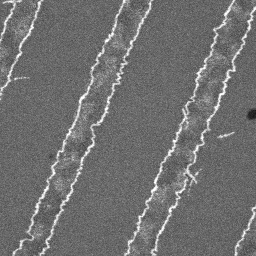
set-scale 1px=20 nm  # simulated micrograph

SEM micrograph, one or a few lines or trenches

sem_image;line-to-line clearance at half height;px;74.9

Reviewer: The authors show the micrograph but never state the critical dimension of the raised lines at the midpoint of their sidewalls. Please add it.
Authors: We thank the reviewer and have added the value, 501 nm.